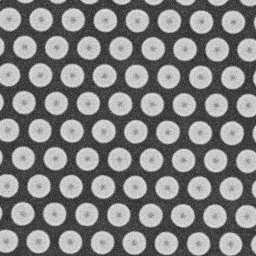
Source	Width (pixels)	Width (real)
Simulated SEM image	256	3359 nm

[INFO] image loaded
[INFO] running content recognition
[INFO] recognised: an array of small figures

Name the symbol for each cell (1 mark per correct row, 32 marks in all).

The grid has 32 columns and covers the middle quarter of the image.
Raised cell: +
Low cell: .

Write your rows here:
.+++.....++......++......++.....
++++....++++....++++....++++....
+++++..++++++..++++++...+++++...
+++++..++++++..++++++...+++++..+
++++....+++++...+++++...+++++...
.++......++......+++.....+++....
................................
.....++......++......++......++.
+...+++++...+++++...++++....++++
+..++++++..++++++..++++++..+++++
+..++++++..++++++..++++++..+++++
....++++....+++++...++++....++++
.............++......++.....++++
................................
++++....++++.....++......++.....
++++....++++....++++....++++....
+++++..++++++..++++++..++++++..+
+++++..++++++..++++++..++++++..+
++++....++++....++++....++++....
.........++......++......++.....
................................
....+++.....+++......++......++.
...+++++...+++++...+++++....++++
+..++++++..++++++..++++++..+++++
+..++++++..++++++..++++++..+++++
....++++....++++...+++++....++++
.....++......++......++......++.
................................
++++....+++.....+++.....+++.....
++++...+++++...+++++...+++++....
++++...++++++..+++++...+++++...+
++++...++++++..+++++...+++++...+